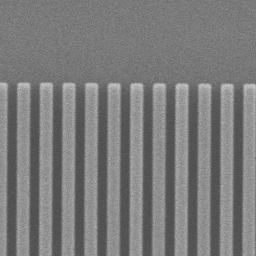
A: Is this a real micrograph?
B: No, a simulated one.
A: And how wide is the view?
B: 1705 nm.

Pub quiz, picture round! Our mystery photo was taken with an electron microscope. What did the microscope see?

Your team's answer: groups of lines, slits or small figures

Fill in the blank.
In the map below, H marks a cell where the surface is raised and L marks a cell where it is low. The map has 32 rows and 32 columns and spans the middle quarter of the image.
LLLLLLLLLLLLLLLLLLLLLLLLLLLLLLLL
LLLLLLLLLLLLLLLLLLLLLLLLLLLLLLLL
LLLLLLLLLLLLLLLLLLLLLLLLLLLLLLLL
LLLLLLLLLLLLLLLLLLLLLLLLLLLLLLLL
LLLLLLLLLLLLLLLLLLLLLLLLLLLLLLLL
HHHLLLHHLLLHHHLLLHHHLLHHHLLLHHHL
HHHLLLHHLLLHHHLLLHHHLLHHHLLLHHHL
HHHLLLHHLLLHHHLLLHHHLLHHHLLLHHHL
HHHLLLHHLLLHHHLLLHHHLLHHHLLLHHHL
HHHLLLHHLLLHHHLLLHHHLLHHHLLLHHHL
HHHLLLHHLLLHHHLLLHHHLLHHHLLLHHHL
HHHLLLHHLLLHHHLLLHHHLLHHHLLLHHHL
HHHLLLHHLLLHHHLLLHHHLLHHHLLLHHHL
HHHLLLHHLLLHHHLLLHHHLLHHHLLLHHHL
HHHLLLHHLLLHHHLLLHHHLLHHHLLLHHHL
HHHLLLHHLLLHHHLLLHHHLLHHHLLLHHHL
HHHLLLHHLLLHHHLLLHHHLLHHHLLLHHHL
HHHLLHHHLLLHHHLLLHHHLLHHHLLLHHHL
HHHLLHHHLLLHHHLLLHHHLLHHHLLLHHHL
HHLLLHHHLLLHHHLLLHHHLLHHHLLLHHHL
HHLLLHHHLLLHHHLLLHHHLLHHHLLLHHHL
HHLLLHHHLLLHHHLLLHHLLLHHHLLLHHHL
HHLLLHHHLLLHHHLLLHHLLLHHHLLLHHHL
HHLLLHHHLLLHHHLLLHHLLLHHHLLLHHHL
HHLLLHHHLLLHHHLLLHHLLLHHHLLLHHHL
HHLLLHHHLLLHHHLLLHHLLLHHHLLLHHHL
HHLLLHHHLLLHHHLLLHHLLLHHHLLLHHHL
HHLLLHHHLLLHHHLLLHHLLLHHHLLLHHHL
HHLLLHHHLLLHHHLLLHHLLLHHHLLLHHHL
HHLLLHHHLLLHHHLLLHHLLLHHHLLLHHHL
HHLLLHHHLLLHHHLLLHHLLLHHHLLLHHHL
HHLLLHHHLLLHHHLLLHHLLLHHHLLLHHHL